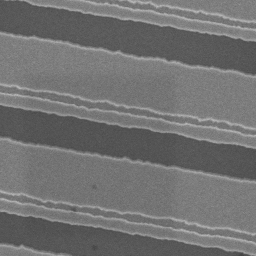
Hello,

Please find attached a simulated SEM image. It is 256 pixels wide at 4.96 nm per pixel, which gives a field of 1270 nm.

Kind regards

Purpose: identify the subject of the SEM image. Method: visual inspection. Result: lines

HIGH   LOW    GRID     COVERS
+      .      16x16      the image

....++++++++++++
..........++++++
+++............+
++++++++........
+++++++++++++++.
++++++++++++++++
++++++++++++++++
.....+++++++++++
...........+++++
+++++...........
+++++++++++.....
++++++++++++++++
++++++++++++++++
.+++++++++++++++
........++++++++
++............++